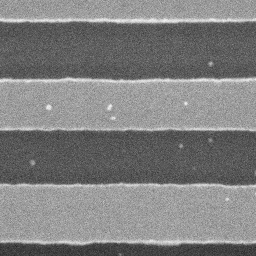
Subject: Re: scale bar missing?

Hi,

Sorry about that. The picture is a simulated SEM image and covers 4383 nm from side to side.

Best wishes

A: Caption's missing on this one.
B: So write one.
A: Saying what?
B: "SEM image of lines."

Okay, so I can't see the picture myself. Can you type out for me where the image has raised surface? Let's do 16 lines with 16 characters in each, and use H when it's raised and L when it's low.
HHHHHHHHHHHHHHHH
LLLLLLLLLLLLLLLL
LLLLLLLLLLLLLLLL
LLLLLLLLLLLLLLLL
LLLLLLLLLLLLLLLL
HHHHHHHHHHHHHHHH
HHHHHHHHHHHHHHHH
HHHHHHHHHHHHHHHH
LLLLLLLLLLLLLLLL
LLLLLLLLLLLLLLLL
LLLLLLLLLLLLLLLL
LLLLLLLLLLLLLLLL
HHHHHHHHHHHHHHHH
HHHHHHHHHHHHHHHH
HHHHHHHHHHHHHHHH
LLLLLLLLLLLLLLLL